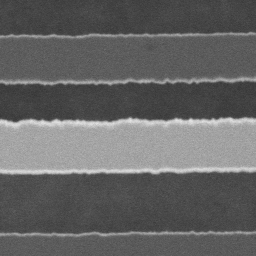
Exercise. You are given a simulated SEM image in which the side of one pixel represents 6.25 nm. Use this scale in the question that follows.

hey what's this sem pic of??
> lines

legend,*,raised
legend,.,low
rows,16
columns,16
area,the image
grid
................
................
****************
****************
****************
................
................
.......**.******
****************
****************
****************
................
................
................
..............**
****************